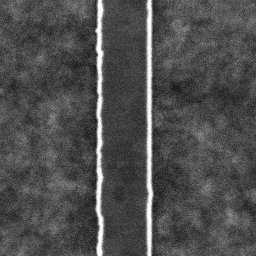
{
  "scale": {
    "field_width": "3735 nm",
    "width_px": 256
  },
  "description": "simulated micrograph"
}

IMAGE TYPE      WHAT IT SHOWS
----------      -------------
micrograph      one or a few lines or trenches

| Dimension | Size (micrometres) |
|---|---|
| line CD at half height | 0.751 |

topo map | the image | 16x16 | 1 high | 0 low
0000001110000000
0000001110000000
0000001110000000
0000001110000000
0000001110000000
0000001110000000
0000001110000000
0000001110000000
0000001110000000
0000001110000000
0000001110000000
0000001110000000
0000001110000000
0000001110000000
0000001110000000
0000001110000000